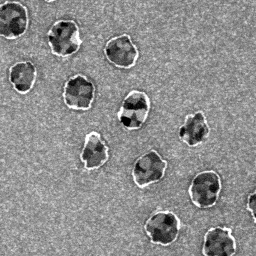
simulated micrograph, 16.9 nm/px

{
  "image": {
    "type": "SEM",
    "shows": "a regular array of raised bodies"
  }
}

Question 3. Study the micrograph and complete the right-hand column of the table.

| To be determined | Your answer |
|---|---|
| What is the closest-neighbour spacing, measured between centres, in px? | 57.1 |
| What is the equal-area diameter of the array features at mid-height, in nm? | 548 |